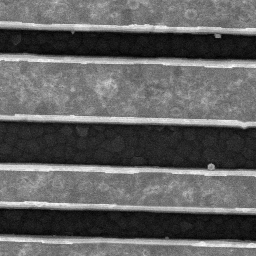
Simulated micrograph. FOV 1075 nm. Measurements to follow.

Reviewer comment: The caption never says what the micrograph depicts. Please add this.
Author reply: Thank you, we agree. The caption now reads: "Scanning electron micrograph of one or a few lines or trenches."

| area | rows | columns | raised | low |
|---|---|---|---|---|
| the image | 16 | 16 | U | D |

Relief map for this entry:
UUUUUUUUUUUUUUUU
UUUUUUUUUUUUUUUU
DDDDDDDDDDDDDDDD
DDDDDDDDDDDDDDDD
UUUUUUUUUUUUUUUU
UUUUUUUUUUUUUUUU
UUUUUUUUUUUUUUUU
DDDDDDUDUUUUUUUU
DDDDDDDDDDDDDDDD
DDDDDDDDDDDDDDDD
UUUUDDDDDDDDDDDD
UUUUUUUUUUUUUUUU
UUUUUUUUUUUUUUUU
DDDDDDDDDDDDDDDD
DDDDDDDDDDDDDDDD
UUUUUUUUUUUUUUUU